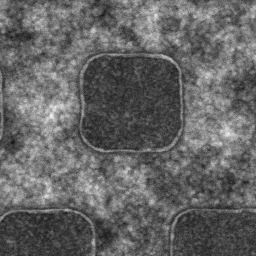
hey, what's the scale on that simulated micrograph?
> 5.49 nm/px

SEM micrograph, raised bodies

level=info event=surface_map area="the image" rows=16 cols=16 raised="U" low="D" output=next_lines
DDDDDDDDDDDDDDDD
DDDDDDDDDDDDDDDD
DDDDDDDDDDDDDDDD
DDDDDDUUUUDDDDDD
DDDDDUUUUUUDDDDD
DDDDDUUUUUUDDDDD
DDDDDUUUUUUDDDDD
DDDDDUUUUUUDDDDD
DDDDDUUUUUUDDDDD
DDDDDDDDDDDDDDDD
DDDDDDDDDDDDDDDD
DDDDDDDDDDDDDDDD
DDDDDDDDDDDDDDDD
UUUUUDDDDDDUUUUU
UUUUUUDDDDDUUUUU
UUUUUUDDDDDUUUUU